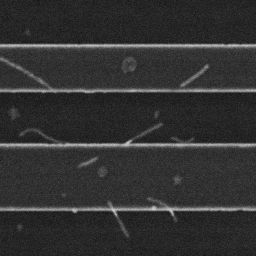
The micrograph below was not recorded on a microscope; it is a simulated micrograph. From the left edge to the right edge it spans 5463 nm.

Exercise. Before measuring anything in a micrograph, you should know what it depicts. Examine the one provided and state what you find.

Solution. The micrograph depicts lines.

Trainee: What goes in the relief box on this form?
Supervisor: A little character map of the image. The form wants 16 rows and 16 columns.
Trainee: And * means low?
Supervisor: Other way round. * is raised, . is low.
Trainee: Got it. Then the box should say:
................
................
................
****************
****************
****************
................
................
................
****************
****************
****************
****************
................
................
................